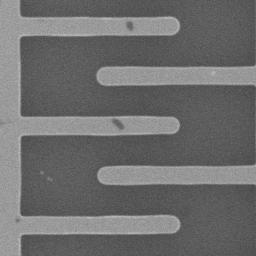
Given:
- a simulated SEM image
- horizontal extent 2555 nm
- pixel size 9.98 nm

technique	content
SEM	groups of lines, slits or small figures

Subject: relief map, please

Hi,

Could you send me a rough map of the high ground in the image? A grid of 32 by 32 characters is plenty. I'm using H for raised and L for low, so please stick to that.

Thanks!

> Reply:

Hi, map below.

HHLLLLLLLLLLLLLLLLLLLLLLLLLLLLLL
HHLLLLLLLLLLLLLLLLLLLLLLLLLLLLLL
HHHHHHHHHHHHHHHHHHHHHHLLLLLLLLLL
HHHHHHHHHHHHHHHHHHHHHHLLLLLLLLLL
HHHLLLLLLLLLLLLLLLLLLLLLLLLLLLLL
HHLLLLLLLLLLLLLLLLLLLLLLLLLLLLLL
HHLLLLLLLLLLLLLLLLLLLLLLLLLLLLLL
HHLLLLLLLLLLLLLLLLLLLLLLLLLLLLLL
HHLLLLLLLLLLLHHHHHHHHHHHHHHHHHHH
HHLLLLLLLLLLHHHHHHHHHHHHHHHHHHHH
HHLLLLLLLLLLLHHHHHHHLLLLLLLLLLLH
HHLLLLLLLLLLLLLLLLLLLLLLLLLLLLLL
HHLLLLLLLLLLLLLLLLLLLLLLLLLLLLLL
HHLLLLLLLLLLLLLLLLLLLLLLLLLLLLLL
HHHLLLLLLLLLLLLLLLLLLLLLLLLLLLLL
HHHHHHHHHHHHHHHHHHHHHHLLLLLLLLLL
HHHHHHHHHHHHHHHHHHHHHHLLLLLLLLLL
HHHLLLLLLLLLLLLLLLLLLLLLLLLLLLLL
HHLLLLLLLLLLLLLLLLLLLLLLLLLLLLLL
HHLLLLLLLLLLLLLLLLLLLLLLLLLLLLLL
HHLLLLLLLLLLLLLLLLLLLLLLLLLLLLLL
HHLLLLLLLLLLHHHHHHHHHHHHHHHHHHHH
HHLLLLLLLLLLHHHHHHHHHHHHHHHHHHHH
HHLLLLLLLLLLLLLLLLLLLLLLLLLLLLLL
HHLLLLLLLLLLLLLLLLLLLLLLLLLLLLLL
HHLLLLLLLLLLLLLLLLLLLLLLLLLLLLLL
HHLLLLLLLLLLLLLLLLLLLLLLLLLLLLLL
HHHHHHHHHHHHHHHHHHHHHHLLLLLLLLLL
HHHHHHHHHHHHHHHHHHHHHHLLLLLLLLLL
HHHLLLLLLLLLLLLLLLLLLLLLLLLLLLLL
HHLLLLLLLLLLLLLLLLLLLLLLLLLLLLLL
HHLLLLLLLLLLLLLLLLLLLLLLLLLLLLLL